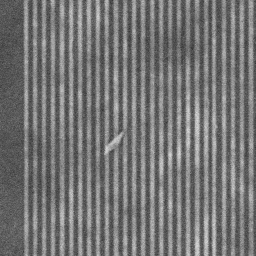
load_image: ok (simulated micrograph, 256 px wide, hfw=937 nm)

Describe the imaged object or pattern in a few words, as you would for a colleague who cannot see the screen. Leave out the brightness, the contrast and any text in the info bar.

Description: parallel lines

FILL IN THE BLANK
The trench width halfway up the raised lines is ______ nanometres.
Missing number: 19.2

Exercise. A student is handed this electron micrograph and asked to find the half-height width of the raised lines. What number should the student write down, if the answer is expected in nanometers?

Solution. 13.3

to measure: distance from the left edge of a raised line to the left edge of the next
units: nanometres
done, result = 32.9